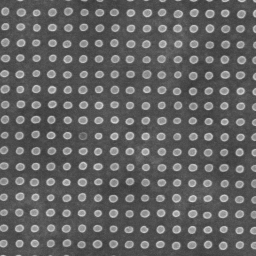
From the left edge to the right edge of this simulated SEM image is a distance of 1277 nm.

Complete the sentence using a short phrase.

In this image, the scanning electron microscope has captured a regular array of raised bodies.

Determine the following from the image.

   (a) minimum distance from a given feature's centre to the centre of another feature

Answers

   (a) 75 nanometres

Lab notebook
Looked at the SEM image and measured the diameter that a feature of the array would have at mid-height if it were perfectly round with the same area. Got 0.0382 µm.